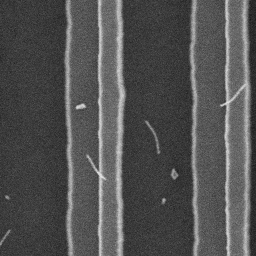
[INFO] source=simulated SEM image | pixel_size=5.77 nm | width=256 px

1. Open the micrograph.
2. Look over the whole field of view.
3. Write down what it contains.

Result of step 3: lines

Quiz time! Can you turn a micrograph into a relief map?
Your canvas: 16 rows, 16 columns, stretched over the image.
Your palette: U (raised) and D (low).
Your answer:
DDDDUUUDDDDDUUUD
DDDDUUUUDDDDUUUD
DDDDUUUUDDDDUUUD
DDDDUUUUDDDDUUUD
DDDDUUUUDDDDUUUD
DDDDUUUUDDDDUUUU
DDDDUUUUDDDDUUUU
DDDDUUUUDDDDUUUU
DDDDUUUUDDDDUUUU
DDDDUUUDDDDDUUUU
DDDDUUUDDDDDUUUU
DDDDUUUDDDDDUUUU
DDDDUUUUDDDDUUUU
DDDDUUUUDDDDUUUD
DDDDUUUUDDDDUUUD
DDDDUUUUDDDDUUUD